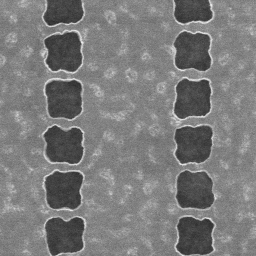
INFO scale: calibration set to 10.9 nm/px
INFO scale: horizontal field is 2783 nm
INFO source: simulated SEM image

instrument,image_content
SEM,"a regular array of holes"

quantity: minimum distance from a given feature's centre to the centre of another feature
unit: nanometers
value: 499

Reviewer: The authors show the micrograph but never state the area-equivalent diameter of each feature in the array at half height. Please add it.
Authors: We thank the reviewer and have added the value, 434 nm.